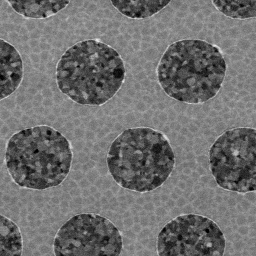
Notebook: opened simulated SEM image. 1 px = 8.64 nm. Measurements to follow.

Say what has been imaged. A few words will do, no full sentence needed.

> raised bodies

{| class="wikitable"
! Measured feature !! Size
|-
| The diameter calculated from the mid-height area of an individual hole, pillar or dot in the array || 574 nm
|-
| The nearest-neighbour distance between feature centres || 0.863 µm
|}